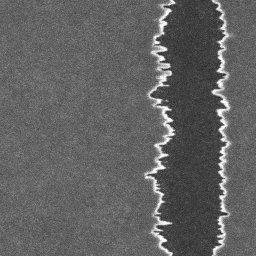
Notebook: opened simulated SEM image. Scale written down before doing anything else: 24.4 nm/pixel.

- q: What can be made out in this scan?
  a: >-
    one or a few lines or trenches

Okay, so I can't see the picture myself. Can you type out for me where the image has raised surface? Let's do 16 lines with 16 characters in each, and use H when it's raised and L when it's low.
HHHHHHHHHHHLLLHH
HHHHHHHHHHLLLLHH
HHHHHHHHHHLLLLHH
HHHHHHHHHHLLLLHH
HHHHHHHHHHLLLLHH
HHHHHHHHHHLLLLHH
HHHHHHHHHHLLLLHH
HHHHHHHHHHHLLLHH
HHHHHHHHHHHLLLHH
HHHHHHHHHHLLLLHH
HHHHHHHHHHLLLLHH
HHHHHHHHHHLLLLHH
HHHHHHHHHHLLLLHH
HHHHHHHHHHLLLLHH
HHHHHHHHHHLLLLHH
HHHHHHHHHHLLLLHH